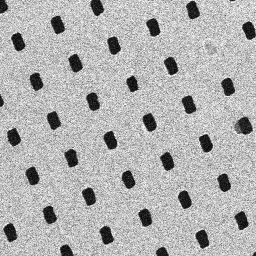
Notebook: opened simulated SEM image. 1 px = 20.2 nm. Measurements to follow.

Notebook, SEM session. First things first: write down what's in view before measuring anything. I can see a regular array of holes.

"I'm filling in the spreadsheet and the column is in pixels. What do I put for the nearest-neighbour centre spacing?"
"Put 42.3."